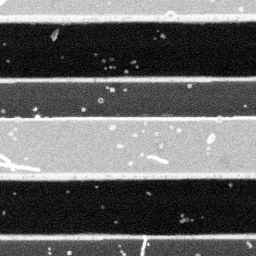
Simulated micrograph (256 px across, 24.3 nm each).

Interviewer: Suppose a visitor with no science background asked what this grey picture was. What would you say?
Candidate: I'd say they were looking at lines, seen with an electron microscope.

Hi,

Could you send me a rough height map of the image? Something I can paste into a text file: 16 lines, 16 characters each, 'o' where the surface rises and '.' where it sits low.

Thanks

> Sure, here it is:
oooooooooooooooo
................
................
................
................
oooooooooooooooo
oooooooooooooooo
oooooooooooooooo
oooooooooooooooo
oooooooooooooooo
oooooooooooooooo
................
................
................
................
oooooooooooooooo